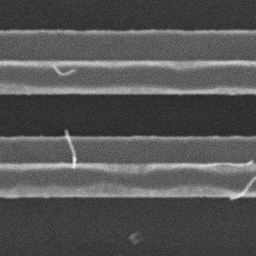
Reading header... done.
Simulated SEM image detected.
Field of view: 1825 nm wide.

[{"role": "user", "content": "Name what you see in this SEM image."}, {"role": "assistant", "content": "lines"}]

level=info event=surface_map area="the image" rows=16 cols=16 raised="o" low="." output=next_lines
................
................
oooooooooooooooo
oooooooooooooooo
oooooooooooooooo
oooooooooooooooo
................
................
................
oooooooooooooooo
oooooooooooooooo
oooooooooooooooo
................
................
................
................